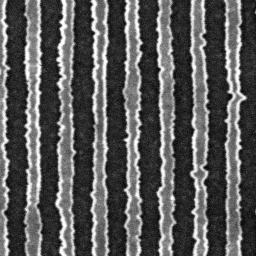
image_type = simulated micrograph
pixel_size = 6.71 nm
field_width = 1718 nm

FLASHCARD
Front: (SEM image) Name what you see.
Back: parallel lines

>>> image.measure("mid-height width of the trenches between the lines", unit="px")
21.6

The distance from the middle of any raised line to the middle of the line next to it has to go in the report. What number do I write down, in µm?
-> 0.224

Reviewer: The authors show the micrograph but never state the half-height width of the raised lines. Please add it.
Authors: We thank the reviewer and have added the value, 78.9 nm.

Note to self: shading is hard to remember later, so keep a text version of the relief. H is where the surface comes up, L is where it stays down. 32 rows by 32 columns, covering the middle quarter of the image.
HHLLLLLLHHLLLLLLHHLLLLLLHHHLLLLL
HHLLLLLHHHLLLLLLHHHLLLLLHHHLLLLL
HHLLLLLLHHLLLLLLHHHLLLLLHHHLLLLL
HHLLLLLHHHLLLLLLHHHLLLLLHHHLLLLL
HHLLLLLLHHLLLLLHHHHLLLLLHHHLLLLL
HHLLLLLLHHLLLLLHHHHLLLLLHHHLLLLL
HHLLLLLLHHLLLLLHHHHLLLLLHHHLLLLL
HHLLLLLLHHLLLLLHHHHLLLLLHHHLLLLL
HHLLLLLLHHLLLLLLHHHLLLLLHHHLLLLL
HHLLLLLLHHLLLLLHHHHLLLLLHHHLLLLL
HHLLLLLLHHLLLLLHHHHLLLLLHHHLLLLL
HHLLLLLLHHLLLLLLHHHLLLLLHHHLLLLL
HHLLLLLLHHLLLLLLHHLLLLLLHHHLLLLL
HHLLLLLLHHLLLLLLHHLLLLLLHHHHLLLL
HHLLLLLLHHLLLLLLHHHLLLLLLHHLLLLL
HHLLLLLLHHLLLLLLHHHLLLLLLHHLLLLL
HHLLLLLLHHLLLLLLHHHLLLLLLHHLLLLL
HHLLLLLLHHLLLLLLHHHLLLLLLHHLLLLL
HHLLLLLLHHLLLLLLHHLLLLLLLHHLLLLL
HHLLLLLLHHLLLLLLHHLLLLLLLHHLLLLL
HHLLLLLLHHHLLLLLHHLLLLLLLHHLLLLL
HHLLLLLLHHHLLLLLHHLLLLLLHHHLLLLL
HHHLLLLLHHLLLLLLHHLLLLLLLHHLLLLL
HHLLLLLLHHLLLLLLHHLLLLLLLHHLLLLL
HHLLLLLLHHLLLLLLHHLLLLLLLHHHLLLL
HHLLLLLLHHLLLLLLHHLLLLLLLHHHLLLL
HHLLLLLHHHLLLLLLHHLLLLLLLHHLLLLL
HHLLLLLLHHLLLLLLHHHLLLLLLHHLLLLL
HHLLLLLLHHLLLLLLHHLLLLLLLHHLLLLL
HHLLLLLLHHLLLLLLHHHLLLLLLHHLLLLL
HHLLLLLHHHLLLLLLHHHLLLLLLHHLLLLL
HHLLLLLLHHHLLLLHHHLLLLLLHHHLLLLL